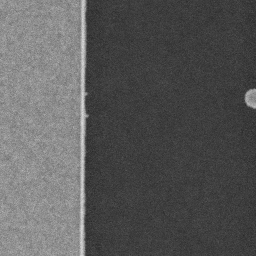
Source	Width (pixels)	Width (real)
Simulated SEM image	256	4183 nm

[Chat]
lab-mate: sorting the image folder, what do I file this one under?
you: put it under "one or a few lines or trenches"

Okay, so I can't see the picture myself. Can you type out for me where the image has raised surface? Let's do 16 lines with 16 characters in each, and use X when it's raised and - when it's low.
XXXXX-----------
XXXXX-----------
XXXXX-----------
XXXXX-----------
XXXXX-----------
XXXXX-----------
XXXXX-----------
XXXXX-----------
XXXXX-----------
XXXXX-----------
XXXXX-----------
XXXXX-----------
XXXXX-----------
XXXXX-----------
XXXXX-----------
XXXXX-----------